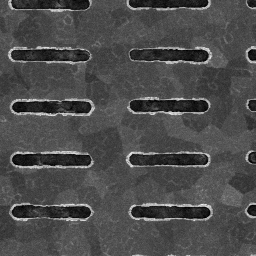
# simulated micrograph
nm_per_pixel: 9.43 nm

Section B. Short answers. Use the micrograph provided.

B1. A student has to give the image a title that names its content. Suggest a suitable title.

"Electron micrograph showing a regular array of holes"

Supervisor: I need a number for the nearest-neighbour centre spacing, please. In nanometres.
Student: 491